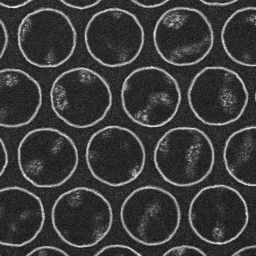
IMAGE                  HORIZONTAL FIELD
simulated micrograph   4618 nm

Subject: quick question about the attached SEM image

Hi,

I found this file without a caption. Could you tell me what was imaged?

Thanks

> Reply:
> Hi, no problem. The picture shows a regular array of raised bodies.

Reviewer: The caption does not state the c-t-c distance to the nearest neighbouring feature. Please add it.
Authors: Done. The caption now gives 1220 nanometers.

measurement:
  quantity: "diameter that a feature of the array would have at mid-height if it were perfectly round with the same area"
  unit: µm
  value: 1.04